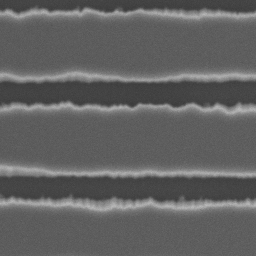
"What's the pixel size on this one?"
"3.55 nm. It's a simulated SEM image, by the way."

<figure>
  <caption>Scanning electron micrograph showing lines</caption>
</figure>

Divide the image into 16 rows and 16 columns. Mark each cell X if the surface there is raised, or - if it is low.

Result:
----------------
XXXXXXXXXXXXXXXX
XXXXXXXXXXXXXXXX
XXXXXXXXXXXXXXXX
XXXXXXXXXXXXXXXX
----------------
----------------
XXXXXXXXXXXXXXXX
XXXXXXXXXXXXXXXX
XXXXXXXXXXXXXXXX
XXXXXXXXXXXXXXXX
----------------
X---------------
XXXXXXXXXXXXXXXX
XXXXXXXXXXXXXXXX
XXXXXXXXXXXXXXXX